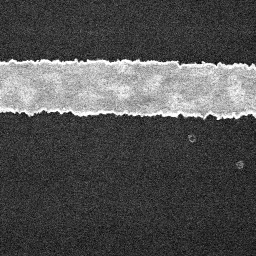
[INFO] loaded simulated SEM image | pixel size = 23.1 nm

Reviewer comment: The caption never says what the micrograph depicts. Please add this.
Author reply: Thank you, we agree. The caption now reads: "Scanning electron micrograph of one or a few lines or trenches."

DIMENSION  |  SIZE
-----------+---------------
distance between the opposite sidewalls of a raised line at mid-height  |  1170 nanometers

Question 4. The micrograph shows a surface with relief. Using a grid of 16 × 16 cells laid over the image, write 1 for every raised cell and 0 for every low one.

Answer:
0000000000000000
0000000000000000
0000000000000000
0000000000000000
1111111111111111
1111111111111111
1111111111111111
0000000000000000
0000000000000000
0000000000000000
0000000000000000
0000000000000000
0000000000000000
0000000000000000
0000000000000000
0000000000000000